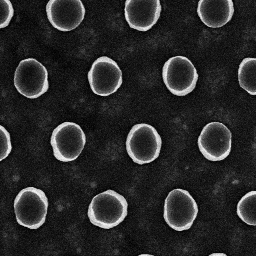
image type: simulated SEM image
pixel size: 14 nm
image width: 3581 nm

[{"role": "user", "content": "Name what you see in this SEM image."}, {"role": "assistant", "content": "a regular array of raised bodies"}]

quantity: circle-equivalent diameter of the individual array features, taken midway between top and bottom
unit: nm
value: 482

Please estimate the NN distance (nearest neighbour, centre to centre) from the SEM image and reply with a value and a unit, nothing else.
1020 nm